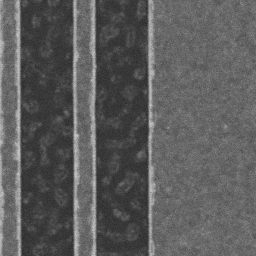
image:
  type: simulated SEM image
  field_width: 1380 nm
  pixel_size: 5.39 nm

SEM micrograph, one or a few lines or trenches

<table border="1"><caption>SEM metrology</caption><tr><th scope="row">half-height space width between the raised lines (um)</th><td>0.296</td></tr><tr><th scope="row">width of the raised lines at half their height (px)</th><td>19.8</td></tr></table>